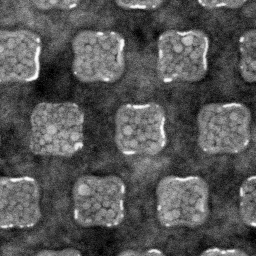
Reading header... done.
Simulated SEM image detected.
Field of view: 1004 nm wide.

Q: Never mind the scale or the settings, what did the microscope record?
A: raised bodies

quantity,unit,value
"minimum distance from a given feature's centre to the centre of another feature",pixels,83.1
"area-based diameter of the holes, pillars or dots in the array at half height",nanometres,204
